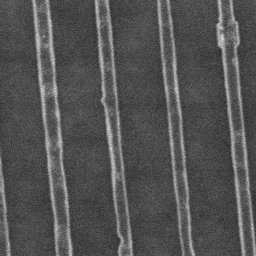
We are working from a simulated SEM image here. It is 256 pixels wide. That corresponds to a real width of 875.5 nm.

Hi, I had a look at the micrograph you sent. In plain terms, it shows one or a few lines or trenches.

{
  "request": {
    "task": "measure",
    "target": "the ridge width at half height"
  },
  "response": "12.7 px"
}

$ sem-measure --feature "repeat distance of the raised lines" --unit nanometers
209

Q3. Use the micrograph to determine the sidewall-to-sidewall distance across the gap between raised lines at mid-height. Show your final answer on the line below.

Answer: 167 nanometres